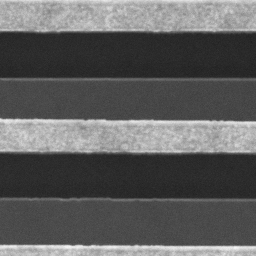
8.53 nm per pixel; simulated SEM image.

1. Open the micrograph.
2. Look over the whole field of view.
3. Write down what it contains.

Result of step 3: lines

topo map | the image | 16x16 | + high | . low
++++++++++++++++
++++++++++++++++
................
................
................
++++++++++++++++
++++++++++++++++
++++++++++++++++
++++++++++++++++
...............+
................
................
+++++++++++++.+.
++++++++++++++++
++++++++++++++++
++++++++++++++++